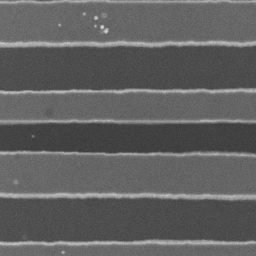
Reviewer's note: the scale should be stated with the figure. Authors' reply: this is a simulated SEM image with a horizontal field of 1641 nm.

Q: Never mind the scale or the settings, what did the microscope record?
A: lines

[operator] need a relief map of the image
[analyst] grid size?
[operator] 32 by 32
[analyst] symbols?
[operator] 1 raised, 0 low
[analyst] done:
11111111111111111111111111111111
11111111111111111111111111111111
11111111111111111111111111111111
11111111111111111111111111111111
11111111111111111111111111111111
00000000000000000011000000000000
00000000000000000000000000000000
00000000000000000000000000000000
00000000000000000000000000000000
00000000000000000000000000000000
00000000000000000000000000000000
00111111111111111111111111111111
11111111111111111111111111111111
11111111111111111111111111111111
11111111111111111111111111111111
00000000000000000000000000000000
00000000000000000000000000000000
00000000000000000000000000000000
00000000000000000000000000000000
11111111111111111111111111111111
11111111111111111111111111111111
11111111111111111111111111111111
11111111111111111111111111111111
11111111111111111111111111111111
00000000000000000000010010011101
00000000000000000000000000000000
00000000000000000000000000000000
00000000000000000000000000000000
00000000000000000000000000000000
00000000000000000000000000000000
11111111111111111111111111111111
11111111111111111111111111111111